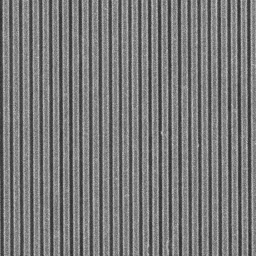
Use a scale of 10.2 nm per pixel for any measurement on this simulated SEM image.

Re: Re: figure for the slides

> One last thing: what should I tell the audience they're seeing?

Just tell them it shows parallel lines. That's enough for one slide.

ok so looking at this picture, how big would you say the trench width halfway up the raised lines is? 44.7 nm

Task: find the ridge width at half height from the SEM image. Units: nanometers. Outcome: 63.8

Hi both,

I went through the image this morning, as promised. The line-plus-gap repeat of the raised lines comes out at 101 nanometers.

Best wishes